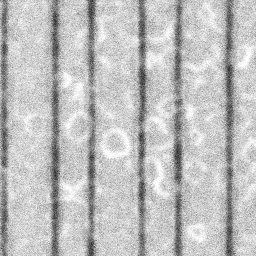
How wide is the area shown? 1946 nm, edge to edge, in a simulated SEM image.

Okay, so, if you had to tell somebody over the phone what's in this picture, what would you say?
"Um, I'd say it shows parallel lines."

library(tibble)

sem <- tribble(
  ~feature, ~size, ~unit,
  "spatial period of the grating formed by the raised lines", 331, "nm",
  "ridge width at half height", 84.5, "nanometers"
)